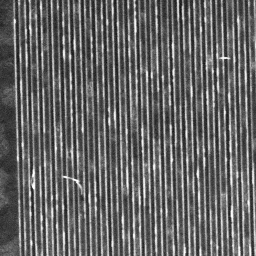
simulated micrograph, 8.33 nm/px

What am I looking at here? parallel lines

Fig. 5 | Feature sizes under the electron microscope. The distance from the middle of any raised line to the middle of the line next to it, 91.1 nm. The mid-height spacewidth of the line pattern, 0.0312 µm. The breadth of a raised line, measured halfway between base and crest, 0.0604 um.